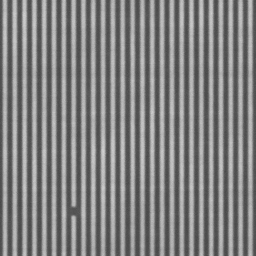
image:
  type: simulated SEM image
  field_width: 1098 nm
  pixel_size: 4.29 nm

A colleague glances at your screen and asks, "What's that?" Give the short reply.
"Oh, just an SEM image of parallel lines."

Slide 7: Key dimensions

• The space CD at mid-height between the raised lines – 0.0231 µm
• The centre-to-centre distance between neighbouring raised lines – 42.1 nanometres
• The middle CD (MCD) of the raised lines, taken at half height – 19.3 nanometers